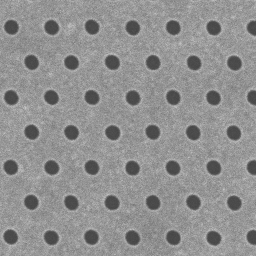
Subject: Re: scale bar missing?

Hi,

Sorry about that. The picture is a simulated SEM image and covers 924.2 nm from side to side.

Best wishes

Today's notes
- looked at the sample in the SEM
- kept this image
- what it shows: a regular array of holes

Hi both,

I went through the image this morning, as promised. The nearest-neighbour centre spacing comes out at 144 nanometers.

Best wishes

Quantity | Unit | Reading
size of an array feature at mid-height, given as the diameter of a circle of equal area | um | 0.0521